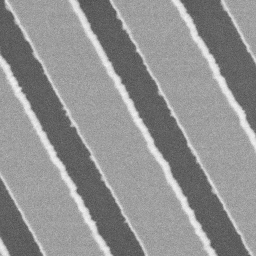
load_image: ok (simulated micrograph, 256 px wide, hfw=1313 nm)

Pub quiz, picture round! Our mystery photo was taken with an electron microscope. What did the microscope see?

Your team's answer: lines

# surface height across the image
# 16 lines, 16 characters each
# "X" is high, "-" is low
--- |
-XXXX--XXXX---XX
-XXXXX--XXXX---X
--XXXX--XXXXX--X
--XXXXX--XXXX---
X--XXXX--XXXXX--
X--XXXXX--XXXX--
XX--XXXX--XXXXX-
XX--XXXXX--XXXX-
XXX--XXXX---XXXX
XXX---XXXX--XXXX
XXXX--XXXXX--XXX
XXXXX--XXXX--XXX
-XXXX--XXXXX--XX
-XXXXX--XXXX--XX
--XXXX--XXXXX--X
--XXXXX--XXXX--X